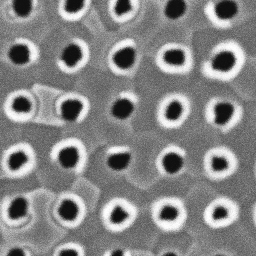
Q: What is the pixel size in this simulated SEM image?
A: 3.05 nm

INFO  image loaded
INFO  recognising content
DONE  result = a regular array of holes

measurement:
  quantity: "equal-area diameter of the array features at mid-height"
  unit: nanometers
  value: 62.3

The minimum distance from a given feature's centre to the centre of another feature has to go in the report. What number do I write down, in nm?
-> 152